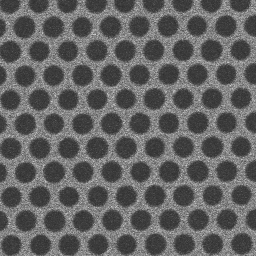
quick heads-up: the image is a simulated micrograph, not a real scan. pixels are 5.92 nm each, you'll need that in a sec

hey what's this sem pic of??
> a regular array of holes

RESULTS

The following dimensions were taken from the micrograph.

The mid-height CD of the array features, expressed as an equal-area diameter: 125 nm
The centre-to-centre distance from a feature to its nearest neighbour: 166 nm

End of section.